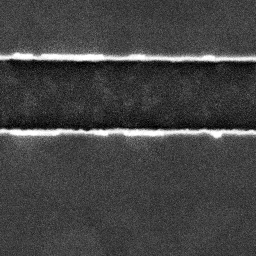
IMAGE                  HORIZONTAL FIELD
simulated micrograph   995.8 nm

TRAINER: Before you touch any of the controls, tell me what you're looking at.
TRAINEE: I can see one or a few lines or trenches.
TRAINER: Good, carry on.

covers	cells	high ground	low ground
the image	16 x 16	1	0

1111111111111111
1111111111111111
1111111111111111
1111111111111111
0000000000000000
0000000000000000
0000000000000000
0000000000000000
1111111111111111
1111111111111111
1111111111111111
1111111111111111
1111111111111111
1111111111111111
1111111111111111
1111111111111111